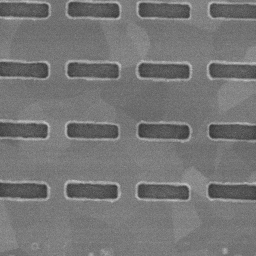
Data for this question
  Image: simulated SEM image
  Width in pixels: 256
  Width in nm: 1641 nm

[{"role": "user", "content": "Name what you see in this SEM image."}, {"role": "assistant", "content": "a regular array of holes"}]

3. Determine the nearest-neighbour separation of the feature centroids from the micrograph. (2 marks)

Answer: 386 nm